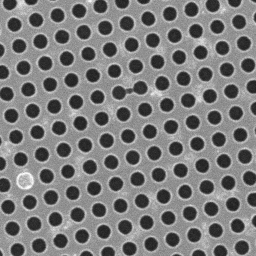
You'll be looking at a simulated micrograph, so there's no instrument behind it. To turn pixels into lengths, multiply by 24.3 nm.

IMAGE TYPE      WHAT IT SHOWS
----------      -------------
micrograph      a regular array of holes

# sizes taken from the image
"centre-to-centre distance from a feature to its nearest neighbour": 531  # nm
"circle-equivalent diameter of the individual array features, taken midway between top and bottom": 14.9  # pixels